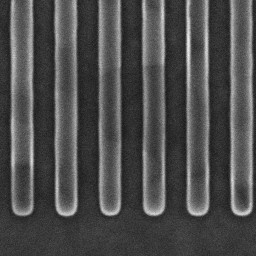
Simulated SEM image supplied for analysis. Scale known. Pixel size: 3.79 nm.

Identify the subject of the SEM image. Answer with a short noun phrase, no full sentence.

wiring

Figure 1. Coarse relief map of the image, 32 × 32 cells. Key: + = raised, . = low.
..++...++...+++...++....++...++.
.+++...+++..+++...++....++...++.
.+++...+++..+++...++.....+...++.
.+++...+++..+++...++.....+...+++
.+++...++...+++...++.....+...++.
.+++...++...+++...+++........++.
..++...++...+++...+++........++.
..++...+++..+++...+++....+...+++
..++...+++..+++...++....++...+++
..++...+++..+++...++...+++...++.
..++...+++..+++...+++..+++...++.
..++...+++..+++...+++..+++...++.
..++...+++..+++...+++..+++...+++
..++...+++..+++...+++..+++...+++
..++...+++..+++...+++..+++...+++
..++...+++..+++...+++..+++...+++
..++...+++..+++...+++..+++...+++
..++...+++..+++...+++..+++...+++
..++...+++..+++...+++..+++...+++
..++...+++..+++...+++..+++...+++
.......+++..+++...+++..+++...+++
..+....+++..+++...++...+.....+++
..++...+++..+++...+++...++...+++
..++....++..+++...+++..+++....++
..++...+++..+++...+++..+++...+++
..++...+++..+++...+++..+++...+++
..++...++....++...++....++...++.
................................
................................
................................
................................
................................